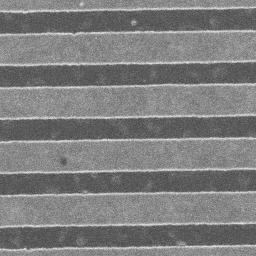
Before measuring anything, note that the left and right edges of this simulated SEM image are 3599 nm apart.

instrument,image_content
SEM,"parallel lines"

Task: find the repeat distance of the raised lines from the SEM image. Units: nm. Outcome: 756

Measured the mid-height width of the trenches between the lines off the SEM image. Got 308 nm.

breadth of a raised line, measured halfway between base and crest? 446 nm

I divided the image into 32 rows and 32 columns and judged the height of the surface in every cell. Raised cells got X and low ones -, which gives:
XXXXXXXXXXXXXXXXXXXXXXXXXXXXXXXX
--XX----------------------------
--------------------------------
--------------------------------
XXXXXXXXXXXXXXXXXXXXXXXXXXXXXXXX
XXXXXXXXXXXXXXXXXXXXXXXXXXXXXXXX
XXXXXXXXXXXXXXXXXXXXXXXXXXXXXXXX
XXXXXXXXXXXXXXXXXXXXXXXXXXXXXXXX
--------------------------------
--------------------------------
------------------------------XX
XXXXXXXXXXXXXXXXXXXXXXXXXXXXXXXX
XXXXXXXXXXXXXXXXXXXXXXXXXXXXXXXX
XXXXXXXXXXXXXXXXXXXXXXXXXXXXXXXX
XXXXXXXXXXXXXXXXXXXXXXXXXXXX----
--------------------------------
--------------------------------
----------XXXXXXXXXXXXXXXXXXXXXX
XXXXXXXXXXXXXXXXXXXXXXXXXXXXXXXX
XXXXXXXXXXXXXXXXXXXXXXXXXXXXXXXX
XXXXXXXXXXXXXXXXXXXXXXXXXXXXXXXX
XXXXXXXXXXX---------------------
--------------------------------
--------------------------------
XXXXXXXXXXXXXXXXXXXXXXXXXXXXXXXX
XXXXXXXXXXXXXXXXXXXXXXXXXXXXXXXX
XXXXXXXXXXXXXXXXXXXXXXXXXXXXXXXX
XXXXXXXXXXXXXXXXXXXXXXXXXXXXXXXX
--------------------------------
--------------------------------
----------------------X---------
XXXXXXXXXXXXXXXXXXXXXXXXXXXXXXXX